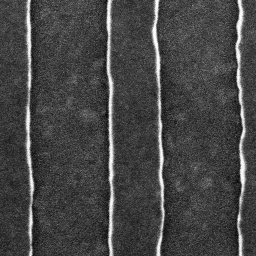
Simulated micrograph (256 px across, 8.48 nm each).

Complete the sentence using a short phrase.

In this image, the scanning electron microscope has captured one or a few lines or trenches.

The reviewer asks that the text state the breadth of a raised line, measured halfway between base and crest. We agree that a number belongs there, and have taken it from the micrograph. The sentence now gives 430 nm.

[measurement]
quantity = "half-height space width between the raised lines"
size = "681 nm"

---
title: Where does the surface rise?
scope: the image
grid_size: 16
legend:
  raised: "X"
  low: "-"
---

XX-----XXX-----X
XX-----XXX-----X
XX-----XXX-----X
XX-----XXX-----X
XX-----XXX-----X
XX-----XXX-----X
XX-----XXX-----X
XX-----XXX-----X
XX-----XXX-----X
XX-----XXX-----X
XX-----XXX-----X
XX-----XXX-----X
XX-----XXX-----X
XX-----XXX-----X
XX-----XXX-----X
XX-----XXX-----X